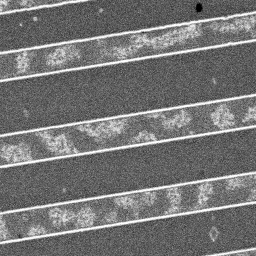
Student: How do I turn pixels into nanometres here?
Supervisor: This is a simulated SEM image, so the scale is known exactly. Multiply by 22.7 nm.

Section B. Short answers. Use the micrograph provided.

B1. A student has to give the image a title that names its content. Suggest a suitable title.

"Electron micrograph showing one or a few lines or trenches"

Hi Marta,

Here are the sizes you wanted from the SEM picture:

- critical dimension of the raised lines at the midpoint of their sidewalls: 0.653 micrometres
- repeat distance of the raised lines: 1800 nanometres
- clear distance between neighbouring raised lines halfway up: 1.05 µm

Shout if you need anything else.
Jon